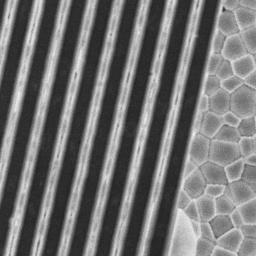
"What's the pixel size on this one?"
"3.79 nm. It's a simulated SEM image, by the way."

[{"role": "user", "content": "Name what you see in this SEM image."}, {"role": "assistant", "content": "parallel lines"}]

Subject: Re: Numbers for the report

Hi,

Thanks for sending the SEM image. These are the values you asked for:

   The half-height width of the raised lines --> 38.9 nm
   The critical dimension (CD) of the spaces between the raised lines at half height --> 15.4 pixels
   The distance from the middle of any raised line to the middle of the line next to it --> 98.2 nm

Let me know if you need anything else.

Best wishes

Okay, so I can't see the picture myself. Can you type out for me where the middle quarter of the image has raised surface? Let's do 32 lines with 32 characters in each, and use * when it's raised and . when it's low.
..***....**....***....***....**.
..**.....**....***....**.....**.
..**....***....***....**....***.
..**....***....**.....**....**..
.***....**.....**....***....**..
.***....**....***....***....**..
.**.....**....***....**....***..
.**....***....**.....**....***..
.**....***....**....***....***..
***....**....***....***....**...
**.....**....***....***....**...
**....***....***....**....***...
**....***....**.....**....***...
**....***....**....***....**....
**....**....***....***....**....
*.....**....***....**....***....
*....***....**.....**....***....
*....***....**....***....**.....
*....**....***....***....**....*
.....**....***....**.....**....*
....***....***....**....***....*
....***....**.....**....***....*
....**.....**....***....**....**
....**....***....**.....**....**
....**....***....**....***....**
...***....**.....**....***....**
...***....**....***....**.....**
...***...***....***....**....***
...**....***....**.....**....***
..***....***....**....***....***
..***....**.....**....***....***
..***....**....***....**.....***